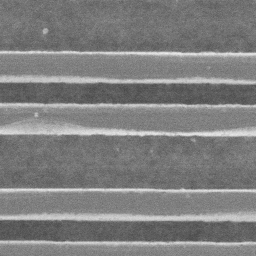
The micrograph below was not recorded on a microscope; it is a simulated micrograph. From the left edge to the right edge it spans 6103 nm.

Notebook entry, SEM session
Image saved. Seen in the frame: lines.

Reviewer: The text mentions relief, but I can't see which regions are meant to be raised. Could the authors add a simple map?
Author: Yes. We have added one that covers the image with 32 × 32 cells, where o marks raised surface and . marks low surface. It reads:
................................
................................
................................
................................
................................
................................
oo..o...........................
oooooooooooooooooooooooooooooooo
oooooooooooooooooooooooooooooooo
oooooooooooooooooooooooooooooooo
................................
................................
................................
oooooooooooooooooooooooooooooooo
oooooooooooooooooooooooooooooooo
oooooooooooooooooooooooooooooooo
.............ooooooooooooooooooo
................................
................................
................................
................................
................................
................................
................................
oooooooooooooooooooooooooooooooo
oooooooooooooooooooooooooooooooo
oooooooooooooooooooooooooooooooo
................................
................................
................................
oooooooooooooooooooooooooooooooo
oooooooooooooooooooooooooooooooo